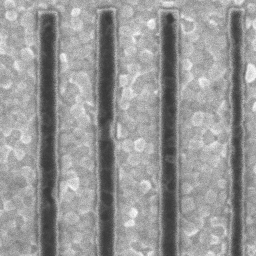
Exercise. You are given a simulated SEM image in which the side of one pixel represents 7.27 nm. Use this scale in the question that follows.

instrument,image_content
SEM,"one or a few lines or trenches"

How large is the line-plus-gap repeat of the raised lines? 458 nm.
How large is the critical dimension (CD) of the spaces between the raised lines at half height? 316 nm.